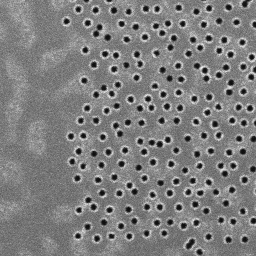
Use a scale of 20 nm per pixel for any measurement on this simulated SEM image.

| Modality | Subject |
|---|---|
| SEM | a regular array of holes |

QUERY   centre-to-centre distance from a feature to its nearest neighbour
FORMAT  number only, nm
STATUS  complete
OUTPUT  256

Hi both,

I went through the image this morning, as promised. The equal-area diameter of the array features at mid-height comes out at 133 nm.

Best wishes